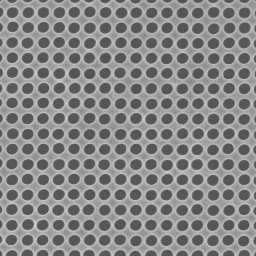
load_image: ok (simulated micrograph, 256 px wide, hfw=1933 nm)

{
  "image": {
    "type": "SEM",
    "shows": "a regular array of holes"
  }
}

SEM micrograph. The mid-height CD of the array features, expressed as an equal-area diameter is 11.1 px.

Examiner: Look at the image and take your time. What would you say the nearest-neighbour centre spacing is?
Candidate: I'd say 0.112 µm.